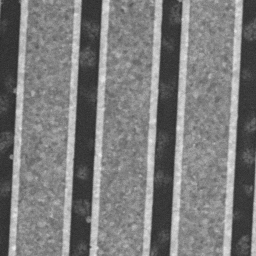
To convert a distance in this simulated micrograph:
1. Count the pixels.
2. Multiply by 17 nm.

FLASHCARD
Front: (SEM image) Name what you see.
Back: one or a few lines or trenches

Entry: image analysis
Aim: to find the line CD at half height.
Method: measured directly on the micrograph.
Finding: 895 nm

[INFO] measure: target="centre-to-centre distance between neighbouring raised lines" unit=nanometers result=1370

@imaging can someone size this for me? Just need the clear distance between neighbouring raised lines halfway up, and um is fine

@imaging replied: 0.481